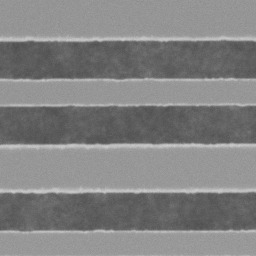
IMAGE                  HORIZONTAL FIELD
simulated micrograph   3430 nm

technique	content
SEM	lines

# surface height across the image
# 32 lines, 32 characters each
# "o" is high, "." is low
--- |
oooooooooooooooooooooooooooooooo
oooooooooooooooooooooooooooooooo
oooooooooooooooooooooooooooooooo
oooooooooooooooooooooooooooooooo
oooooooooooooooooooooooooooooooo
................................
................................
................................
................................
................................
oooooooooooooooooooooooooooooooo
oooooooooooooooooooooooooooooooo
oooooooooooooooooooooooooooooooo
................................
................................
................................
................................
................................
oooooooooooooooooooooooooooooooo
oooooooooooooooooooooooooooooooo
oooooooooooooooooooooooooooooooo
oooooooooooooooooooooooooooooooo
oooooooooooooooooooooooooooooooo
oooooooooooooooooooooooooooooooo
................................
................................
................................
................................
................................
oooooooooooooooooooooooooooooooo
oooooooooooooooooooooooooooooooo
oooooooooooooooooooooooooooooooo